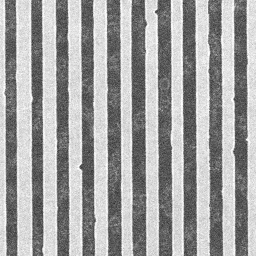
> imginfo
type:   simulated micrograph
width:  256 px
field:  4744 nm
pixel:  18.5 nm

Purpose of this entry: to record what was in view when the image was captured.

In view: parallel lines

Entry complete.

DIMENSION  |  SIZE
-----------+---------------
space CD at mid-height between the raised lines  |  262 nm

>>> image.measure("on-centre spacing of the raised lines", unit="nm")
473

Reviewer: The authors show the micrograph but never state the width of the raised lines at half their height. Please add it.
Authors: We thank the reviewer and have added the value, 11.4 px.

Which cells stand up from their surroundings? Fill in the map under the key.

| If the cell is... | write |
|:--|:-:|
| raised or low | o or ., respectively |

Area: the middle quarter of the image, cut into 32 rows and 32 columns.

..oo....oo....ooo....oo....oo...
.ooo....oo....ooo....oo....oo...
.ooo....oo....ooo....oo....ooo..
.ooo....oo....ooo....oo....oo...
.ooo....oo....ooo....oo....oo...
.ooo....oo....ooo....oo....oo...
.ooo....ooo...ooo....oo....oo...
..oo....ooo...ooo....oo....oo...
..oo....ooo...ooo....oo....oo...
..oo....ooo...ooo....oo....oo...
..oo....ooo...ooo....oo....oo...
.ooo....ooo....oo....oo....oo...
.ooo....ooo....oo....oo....ooo..
.ooo....ooo....oo....oo....ooo..
.ooo....ooo....oo....oo....ooo..
.ooo....ooo....oo....oo....oo...
.ooo....ooo....oo....oo....oo...
.ooo....ooo....oo....oo....oo...
..oo....ooo....oo....oo....ooo..
.ooo....ooo....oo....oo....ooo..
.ooo....ooo....oo....oo....ooo..
.ooo....ooo....oo....oo....ooo..
.ooo....ooo....oo....oo....oo...
.ooo....ooo....oo....oo....oo...
.ooo....ooo....oo....oo....ooo..
..oo....ooo....oo....oo....ooo..
..oo....ooo....oo....oo....ooo..
.ooo....ooo....oo....oo....oo...
.ooo....ooo....oo....oo....oo...
.ooo....ooo....oo....oo....oo...
.ooo....ooo....oo....oo....oo...
..oo....ooo....oo....oo....oo...